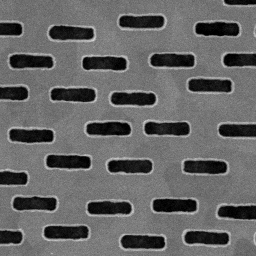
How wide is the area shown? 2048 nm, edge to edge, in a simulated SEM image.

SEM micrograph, a regular array of holes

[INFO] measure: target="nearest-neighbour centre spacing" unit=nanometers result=362